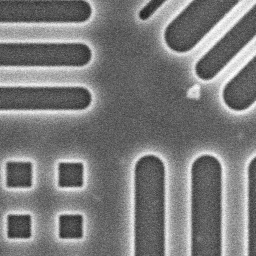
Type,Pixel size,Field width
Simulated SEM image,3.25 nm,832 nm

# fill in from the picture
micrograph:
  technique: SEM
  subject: groups of lines, slits or small figures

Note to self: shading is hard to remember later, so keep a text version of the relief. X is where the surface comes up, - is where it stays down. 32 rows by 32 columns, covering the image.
-----------XXXXXXX--XXX-------XX
-----------XXXXXX--XXX-------XX-
-----------XXXXXXXXXX-------XX--
XXXXXXXXXXXXXXXXXXXXX------XX---
XXXXXXXXXXXXXXXXXXXX------XX----
-----------XXXXXXXXXX----XX----X
-----------XXXXXXXXXXX-XXX----XX
-----------XXXXXXXXXXXXXX----XX-
XXXXXXXXXXXXXXXXXXXXXXXX----XX--
XXXXXXXXXXXXXXXXXXXXXXXXX--XX---
XXXXXXXXXXXXXXXXXXXXXXXXXXXX----
-----------XXXXXXXXXXXXXXXXX----
-----------XXXXXXXXXXXXXXXXX----
-----------XXXXXXXXXXXXXXXXXX--X
XXXXXXXXXXXXXXXXXXXXXXXXXXXXXXXX
XXXXXXXXXXXXXXXXXXXXXXXXXXXXXXXX
XXXXXXXXXXXXXXXXXXXXXXXXXXXXXXXX
XXXXXXXXXXXXXXXXXXXXXXXXXXXXXXXX
XXXXXXXXXXXXXXXXXXXXXXXXXXXXXXXX
XXXXXXXXXXXXXXXXXX--XXXXX--XXXXX
X---XXX---XXXXXXX---XXXX----XXX-
X---XXX----XXXXXX----XXX----XXX-
X---XXX----XXXXXX----XXX----XXX-
X---XXXX--XXXXXXX----XXX----XXX-
XXXXXXXXXXXXXXXXX----XXX----XXX-
XXXXXXXXXXXXXXXXX----XXX----XXX-
XXXXXXXXXXXXXXXXX----XXX----XXX-
X---XXX---XXXXXXX----XXX----XXX-
X---XXX---XXXXXXX----XXX----XXX-
X---XXX---XXXXXXX----XXX----XXX-
XXXXXXXXXXXXXXXXX----XXX----XXX-
XXXXXXXXXXXXXXXXX----XXX----XXX-